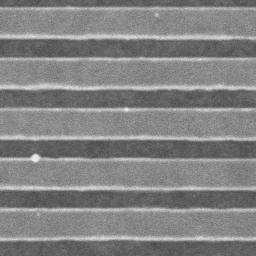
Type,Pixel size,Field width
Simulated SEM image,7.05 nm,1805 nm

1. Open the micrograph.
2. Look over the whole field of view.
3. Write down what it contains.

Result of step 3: lines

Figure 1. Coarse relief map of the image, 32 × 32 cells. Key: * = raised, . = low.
................................
********************************
********************************
********************************
********************************
................................
................................
********************************
********************************
********************************
********************************
................................
................................
................................
********************************
********************************
********************************
.......................*****.***
................................
....*...........................
********************************
********************************
********************************
********************************
................................
................................
********************************
********************************
********************************
********************************
................................
................................